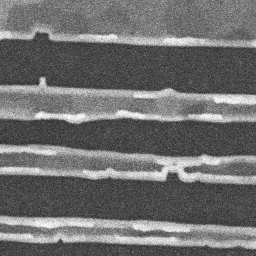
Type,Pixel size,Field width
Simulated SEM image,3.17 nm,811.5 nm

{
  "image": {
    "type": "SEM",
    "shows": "one or a few lines or trenches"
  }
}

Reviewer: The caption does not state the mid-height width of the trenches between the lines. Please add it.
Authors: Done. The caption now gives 146 nanometres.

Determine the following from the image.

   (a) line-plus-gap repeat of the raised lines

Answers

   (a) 202 nanometers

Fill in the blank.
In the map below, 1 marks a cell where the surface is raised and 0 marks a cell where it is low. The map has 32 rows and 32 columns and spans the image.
11111111111111111111111111111111
11111111111111111111111111111111
11111111111111111111111111111111
11111111111111111111111111111111
11110011111111111111111111111111
00000000000000000000000001011111
00000000000000000000000000000000
00000000000000000000000000000000
00000000000000000000000000000000
00000000000000000000000000000000
00000100000000000000000000000000
11111111111110000000010000000000
11111111111111111111111111111111
11111111111111111111111111111111
00111111111111011111111111111111
00000000000000000000000000000000
00000000000000000000000000000000
00000000000000000000000000000000
11110000000000000000000000000000
11111111111111111000000000000000
11111111111111111111111111111111
11111111111111111111101111111111
00000000000000000000000001111111
00000000000000000000000000000000
00000000000000000000000000000000
00000000000000000000000000000000
00000000000000000000000000000000
11010000000000000000000000000000
11111111111111111111111111100000
11111111111111111111111111111111
00000000000000000000000000111111
00000000000000000000000000000000